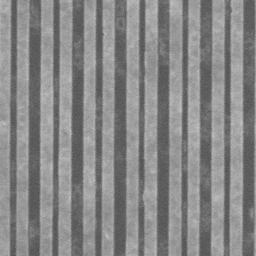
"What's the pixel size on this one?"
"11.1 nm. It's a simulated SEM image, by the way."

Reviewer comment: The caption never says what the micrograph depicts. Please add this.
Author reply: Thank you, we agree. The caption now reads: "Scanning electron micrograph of parallel lines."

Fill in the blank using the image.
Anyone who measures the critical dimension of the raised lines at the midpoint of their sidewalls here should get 132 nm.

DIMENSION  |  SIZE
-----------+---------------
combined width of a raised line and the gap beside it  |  0.238 um